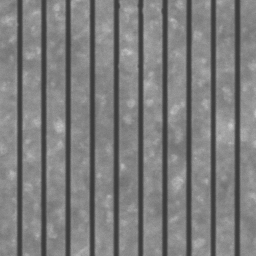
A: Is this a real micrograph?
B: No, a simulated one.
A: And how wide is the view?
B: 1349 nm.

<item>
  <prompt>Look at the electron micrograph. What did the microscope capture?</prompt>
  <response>parallel lines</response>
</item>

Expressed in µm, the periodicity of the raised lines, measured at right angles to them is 0.128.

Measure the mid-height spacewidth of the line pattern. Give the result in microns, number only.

0.029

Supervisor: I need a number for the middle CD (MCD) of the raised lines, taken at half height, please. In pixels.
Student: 18.1